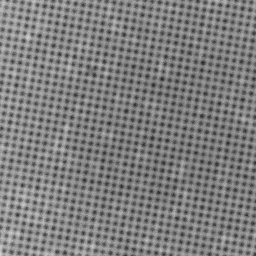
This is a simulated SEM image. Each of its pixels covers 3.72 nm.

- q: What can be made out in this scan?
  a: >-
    a regular array of holes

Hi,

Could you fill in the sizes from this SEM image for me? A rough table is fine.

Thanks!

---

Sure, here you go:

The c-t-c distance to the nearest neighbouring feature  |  27.1 nanometres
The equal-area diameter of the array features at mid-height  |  13.9 nm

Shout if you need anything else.